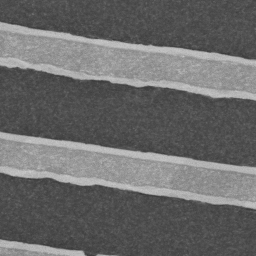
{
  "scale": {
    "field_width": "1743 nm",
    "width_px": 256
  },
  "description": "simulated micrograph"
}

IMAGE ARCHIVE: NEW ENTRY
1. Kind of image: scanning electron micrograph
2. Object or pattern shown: one or a few lines or trenches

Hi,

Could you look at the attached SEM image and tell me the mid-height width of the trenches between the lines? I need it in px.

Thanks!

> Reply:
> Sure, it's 71.9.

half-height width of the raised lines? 233 nm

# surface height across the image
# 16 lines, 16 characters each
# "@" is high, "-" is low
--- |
----------------
----------------
@@@@@@----------
@@@@@@@@@@@@@---
----@@@@@@@@@@@@
------------@@@@
----------------
----------------
----------------
@@@@@@@@--------
@@@@@@@@@@@@@@@-
-------@@@@@@@@@
-------------@@@
----------------
----------------
@@--------------